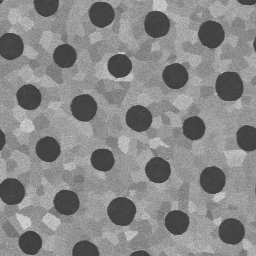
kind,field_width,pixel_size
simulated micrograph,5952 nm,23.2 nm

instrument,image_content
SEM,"a regular array of holes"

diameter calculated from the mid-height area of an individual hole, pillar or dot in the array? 601 nm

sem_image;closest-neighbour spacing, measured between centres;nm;1270